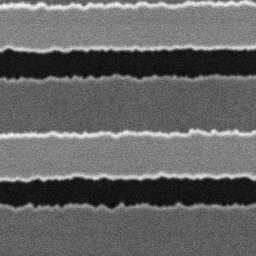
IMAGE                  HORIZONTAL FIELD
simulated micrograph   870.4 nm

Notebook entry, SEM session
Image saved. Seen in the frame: lines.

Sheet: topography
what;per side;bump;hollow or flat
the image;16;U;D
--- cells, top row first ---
UUUUUUUUUUUUUUUU
UUUUUUUUUUUUUUUU
UUUUUUUUUUUUUUUU
DDDDDDDDDDDDDDDD
DDDDDDDDDDDDDDDD
UUUUUUUUUUUUUUUU
UUUUUUUUUUUUUUUU
UUUUUUUUUUUUUUUU
UUUUUUUUUUUUUUUU
UUUUUUUUUUUUUUUU
UUUUUUUUUUUUUUUU
DDDDDDDDDDDDDDDD
DDDDDDDDDDDDDDDD
UUUUUUUUUUUUUUUU
UUUUUUUUUUUUUUUU
UUUUUUUUUUUUUUUU